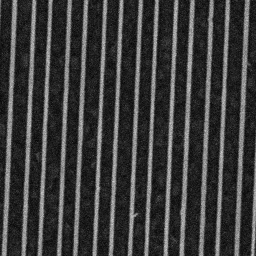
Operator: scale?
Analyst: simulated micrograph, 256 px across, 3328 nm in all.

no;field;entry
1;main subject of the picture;parallel lines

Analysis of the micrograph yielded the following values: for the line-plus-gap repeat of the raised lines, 232 nanometres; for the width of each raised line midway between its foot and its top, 0.0487 microns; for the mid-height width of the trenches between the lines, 14.9 px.